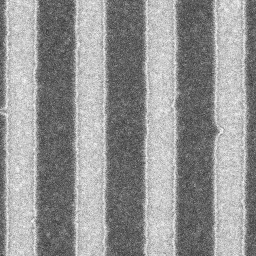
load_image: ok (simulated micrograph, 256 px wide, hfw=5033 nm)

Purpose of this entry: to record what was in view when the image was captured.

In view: one or a few lines or trenches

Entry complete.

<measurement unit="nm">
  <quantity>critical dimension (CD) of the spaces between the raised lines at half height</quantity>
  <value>524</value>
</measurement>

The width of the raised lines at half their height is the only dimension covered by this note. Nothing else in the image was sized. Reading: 836 nanometers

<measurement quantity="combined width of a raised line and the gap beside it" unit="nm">1370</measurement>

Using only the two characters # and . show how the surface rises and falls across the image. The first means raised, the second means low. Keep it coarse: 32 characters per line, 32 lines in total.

#...######...#####....#####...##
#...######...#####....#####...##
#...######...#####....#####...##
#...######...#####....#####...##
#...######...#####....#####...##
#...######...#####....#####...##
#...######...#####....#####....#
#...######...#####....#####...##
#...######...#####....#####...##
#...######...#####....#####...##
#...######...######...#####...##
#...######...######...#####....#
#...######...#####....#####....#
#...######...######...#####....#
#...######...#####....#####....#
#...######...#####....#####....#
#...######...######...######...#
#...######...#####....#####...##
#...######...#####....#####...##
#...######...#####....#####....#
#...######...#####....#####....#
#...######...#####....#####...##
#...######...#####....#####...##
#...######...#####....#####...##
#...######...#####....#####...##
#...######...#####....#####...##
#...######...#####....#####...##
#...######...#####....#####...##
#...######...#####....#####...##
#...######...#####....#####...##
#...######...#####....#####...##
#...######...#####....#####...##